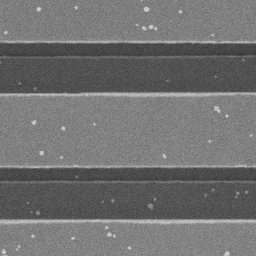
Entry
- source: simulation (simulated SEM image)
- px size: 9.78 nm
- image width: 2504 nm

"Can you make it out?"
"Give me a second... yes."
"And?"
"lines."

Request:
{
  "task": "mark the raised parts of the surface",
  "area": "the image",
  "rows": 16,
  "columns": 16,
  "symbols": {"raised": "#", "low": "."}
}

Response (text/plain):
################
################
################
................
................
................
################
################
################
################
................
................
................
................
################
################